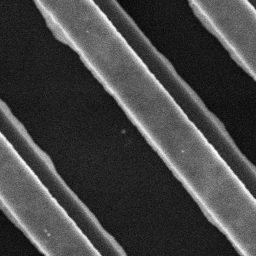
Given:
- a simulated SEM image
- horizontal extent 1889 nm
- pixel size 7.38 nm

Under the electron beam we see lines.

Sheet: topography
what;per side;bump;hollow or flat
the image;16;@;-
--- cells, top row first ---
---@@@@@----@@@@
---@@@@@-----@@@
----@@@@@-----@@
-----@@@@@-----@
------@@@@@-----
-------@@@@@----
--------@@@@@---
@-------@@@@@---
@@-------@@@@@--
@@--------@@@@@-
@@@--------@@@@@
@@@@--------@@@@
@@@@@-------@@@@
-@@@@@-------@@@
--@@@@--------@@
--@@@@@--------@